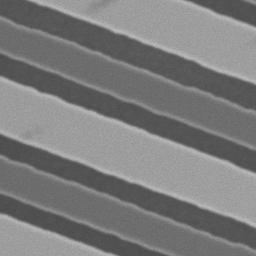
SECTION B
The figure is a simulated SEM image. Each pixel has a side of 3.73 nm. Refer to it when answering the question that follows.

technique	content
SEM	lines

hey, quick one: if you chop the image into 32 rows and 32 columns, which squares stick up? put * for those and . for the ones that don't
.....*******************........
........*******************.....
*.........********************..
****.........*******************
*******.........****************
**********........**************
************.........***********
..************..........********
.....************.........******
........************.........***
**........************..........
*****........*************......
********.......*************....
**********........************..
*************........***********
****************.......*********
******************........******
..*******************........***
.....*******************.......*
.......*******************......
***.......*******************...
*****........******************.
********........****************
***********.......**************
.*************.......***********
....*************.......********
......*************........*****
**.......*************........**
*****.......************........
********.......************.....
***********......*************..
*************.......************